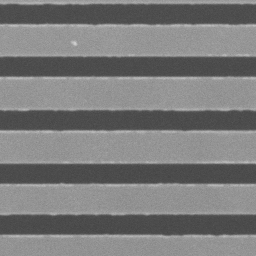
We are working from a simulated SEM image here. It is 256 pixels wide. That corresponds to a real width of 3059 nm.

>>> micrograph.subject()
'lines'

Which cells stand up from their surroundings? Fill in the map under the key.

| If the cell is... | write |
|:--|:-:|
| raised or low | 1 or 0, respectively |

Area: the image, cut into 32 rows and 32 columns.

10111111111000010010000010000011
00000000000000000000000000000000
00000000000000000000000000000000
11111111111111111111111111111111
11111111111111111111111111111111
11111111111111111111111111111111
11111111111111111111111111111111
00000000000000000000000000000000
00000000000000000000000000000000
00000000000000000000000000000000
11111111111111111111111111111111
11111111111111111111111111111111
11111111111111111111111111111111
11111111111111111111111111111111
00000000000000000000000000000000
00000000000000000000000000000000
11111111111111111111111111111111
11111111111111111111111111111111
11111111111111111111111111111111
11111111111111111111111111111111
00000000000000000000000000000000
00000000000000000000000000000000
00000000000000000000000000000000
11111111111111111111111111111111
11111111111111111111111111111111
11111111111111111111111111111111
11111111111111111111111111111111
00000000000000000000000000000000
00000000000000000000000000000000
11111111111111111111111111111111
11111111111111111111111111111111
11111111111111111111111111111111